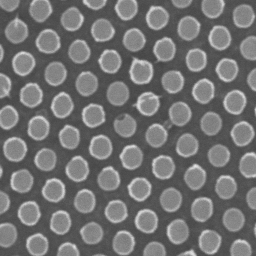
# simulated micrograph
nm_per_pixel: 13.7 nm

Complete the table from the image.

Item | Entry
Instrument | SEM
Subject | a regular array of raised bodies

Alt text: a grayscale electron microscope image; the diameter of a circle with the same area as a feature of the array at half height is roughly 304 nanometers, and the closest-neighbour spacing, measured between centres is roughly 0.439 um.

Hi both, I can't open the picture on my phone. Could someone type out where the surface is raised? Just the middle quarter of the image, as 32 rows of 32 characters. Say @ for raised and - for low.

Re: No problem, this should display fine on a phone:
---------@@@@@---@@@@@---------@
----------@@@----@@@@@----------
----@@@----------@@@@@---@@@@---
---@@@@@---------@@@@@---@@@@@--
---@@@@@----------@@@----@@@@@--
---@@@@@----@@@@---------@@@@@--
---@@@@@---@@@@@----------@@@---
----@@@----@@@@@----@@----------
@----------@@@@@---@@@@@--------
@@---------@@@@---@@@@@@--------
@@----@@@---------@@@@@@---@@@@-
@@---@@@@@---------@@@@----@@@@-
@----@@@@@----------@@----@@@@@@
-----@@@@@-----@@----------@@@@-
-----@@@@@---@@@@@---------@@@@-
------@@-----@@@@@----@@--------
@@@----------@@@@@---@@@@-------
@@@@----------@@@----@@@@@----@-
@@@@---@@@@----------@@@@@---@@@
@@@@---@@@@@---------@@@@---@@@@
@@@----@@@@@-----@----@@----@@@@
------@@@@@@---@@@@---------@@@@
-------@@@@@--@@@@@@---------@@@
--@@----@@----@@@@@----@@@@-----
-@@@@----------@@@@---@@@@@-----
-@@@@@---------@@@@---@@@@@@----
-@@@@@----@@@---------@@@@@----@
-@@@@@---@@@@----------@@@@---@@
--@@@----@@@@@----------@@----@@
---------@@@@@---@@@@----------@
---------@@@@---@@@@@@---------@
-----@----------@@@@@@---@@@----